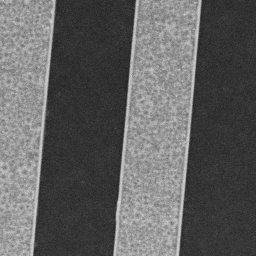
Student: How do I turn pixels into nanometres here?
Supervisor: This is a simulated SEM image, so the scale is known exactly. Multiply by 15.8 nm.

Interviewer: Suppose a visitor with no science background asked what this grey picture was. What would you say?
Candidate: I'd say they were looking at one or a few lines or trenches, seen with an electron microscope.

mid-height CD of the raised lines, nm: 992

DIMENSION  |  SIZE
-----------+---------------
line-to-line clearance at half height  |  1.3 µm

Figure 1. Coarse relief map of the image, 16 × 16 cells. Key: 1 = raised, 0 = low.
1110000001110000
1110000011110000
1110000011110000
1110000011110000
1110000011110000
1110000011110000
1110000011110000
1110000011110000
1110000011110000
1110000011110000
1100000011110000
1100000011100000
1100000111100000
1100000111100000
1100000111100000
1100000111100000